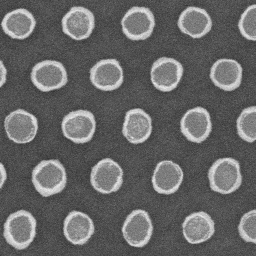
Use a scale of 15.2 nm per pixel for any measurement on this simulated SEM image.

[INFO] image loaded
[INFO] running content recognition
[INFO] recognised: a regular array of raised bodies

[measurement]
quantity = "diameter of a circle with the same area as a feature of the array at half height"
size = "460 nm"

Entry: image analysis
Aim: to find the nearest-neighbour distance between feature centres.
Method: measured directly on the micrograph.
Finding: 875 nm